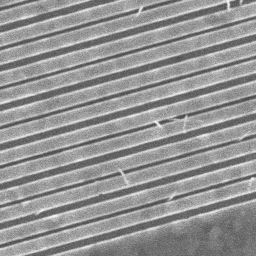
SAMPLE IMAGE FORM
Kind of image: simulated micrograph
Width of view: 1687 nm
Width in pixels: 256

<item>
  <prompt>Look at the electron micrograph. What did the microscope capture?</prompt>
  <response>parallel lines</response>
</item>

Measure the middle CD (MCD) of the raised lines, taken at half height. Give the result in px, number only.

12.8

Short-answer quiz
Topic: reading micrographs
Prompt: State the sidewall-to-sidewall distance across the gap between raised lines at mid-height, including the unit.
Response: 47.7 nm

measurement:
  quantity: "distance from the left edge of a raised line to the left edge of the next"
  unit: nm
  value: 125